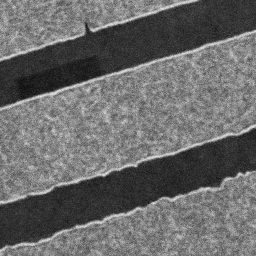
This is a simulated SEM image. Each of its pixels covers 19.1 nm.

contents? one or a few lines or trenches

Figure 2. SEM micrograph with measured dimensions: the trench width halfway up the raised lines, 881 nm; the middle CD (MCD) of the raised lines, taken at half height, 1740 nm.